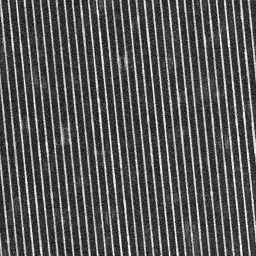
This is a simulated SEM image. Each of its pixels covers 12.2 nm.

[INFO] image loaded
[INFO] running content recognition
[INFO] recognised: parallel lines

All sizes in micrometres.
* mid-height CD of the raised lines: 0.0136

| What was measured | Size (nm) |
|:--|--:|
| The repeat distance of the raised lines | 97.1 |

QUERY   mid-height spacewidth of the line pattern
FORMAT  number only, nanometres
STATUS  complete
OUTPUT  83.4